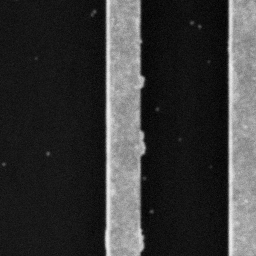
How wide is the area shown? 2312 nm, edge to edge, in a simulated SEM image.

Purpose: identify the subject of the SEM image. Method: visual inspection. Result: lines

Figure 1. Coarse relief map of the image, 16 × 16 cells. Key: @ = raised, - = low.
-------@@-----@@
-------@@-----@@
-------@@-----@@
-------@@-----@@
-------@@-----@@
-------@@-----@@
-------@@-----@@
-------@@-----@@
-------@@-----@@
-------@@-----@@
-------@@-----@@
-------@@-----@@
-------@@-----@@
-------@@-----@@
-------@@-----@@
-------@@-----@@